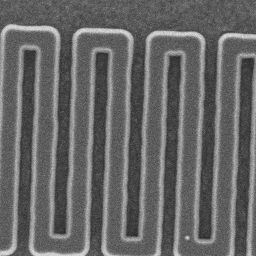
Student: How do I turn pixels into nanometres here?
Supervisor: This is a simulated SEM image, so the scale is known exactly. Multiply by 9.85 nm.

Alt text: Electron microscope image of groups of lines, slits or small figures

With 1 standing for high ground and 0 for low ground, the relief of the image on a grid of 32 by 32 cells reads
00000000000000000000000000000000
00000000000000000000000000000000
00000000000000000000000000000000
01100000000000000000000000000000
11111110011111110001111110001100
11111110011111110011111110011111
11100110011101110011111110011111
11100110011100110011100110011100
11100110011100110011100110011100
11100110011100110011100110011100
11000110011100110011100110011100
11000110011100110011100110011100
11000110011100110011100110011100
11001110011100110011100110011100
11001110011100110011100110011100
11001110011000110011100110011100
11001110011000110011100110011100
11001110011001110011100110011100
11001110011001110011001110011100
11001110011001110011001110011100
11001110011001110011001110011100
11001110011001110011001110011001
11001110011001110011001110011001
11001110011001110011001110011001
11001110011001110011001110011001
11001110011001110011001110011001
11001110011001110011001110011001
11001110011001110011001110011001
11001110011001110011001110011001
11001111111001110111001110011001
11001111111001111111001111111001
10001111111001111111001111111001